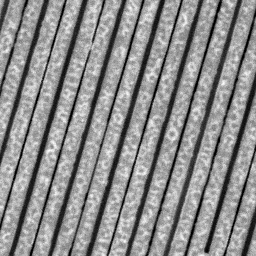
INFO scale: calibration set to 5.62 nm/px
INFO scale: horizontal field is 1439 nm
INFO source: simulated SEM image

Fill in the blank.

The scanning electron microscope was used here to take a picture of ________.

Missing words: parallel lines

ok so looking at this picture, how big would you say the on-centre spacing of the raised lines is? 105 nanometres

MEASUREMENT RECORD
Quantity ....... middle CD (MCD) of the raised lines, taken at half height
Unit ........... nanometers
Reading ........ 83.4